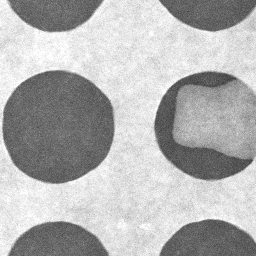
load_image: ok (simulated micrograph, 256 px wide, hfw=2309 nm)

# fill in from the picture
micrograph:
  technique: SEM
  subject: holes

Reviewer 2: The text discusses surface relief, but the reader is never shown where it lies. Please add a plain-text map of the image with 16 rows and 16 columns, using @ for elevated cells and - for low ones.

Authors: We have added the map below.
@-----@@@@------
@@---@@@@@@@---@
@@@@@@@@@@@@@@@@
@@@@@@@@@@@@@@@@
@@@-@@@@@@@@@-@@
@-----@@@@@-----
-------@@@------
-------@@@------
-------@@@------
-------@@@------
@-----@@@@@----@
@@@@@@@@@@@@@@@@
@@@@@@@@@@@@@@@@
@@@@@@@@@@@@@@@@
@@----@@@@@----@
@------@@@------